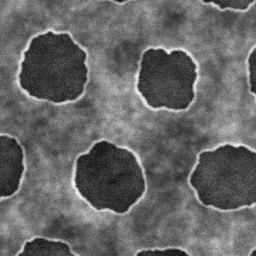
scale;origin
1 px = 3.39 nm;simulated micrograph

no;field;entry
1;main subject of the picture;holes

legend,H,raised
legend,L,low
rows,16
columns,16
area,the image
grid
HHHHHHHHHHHHHHLH
HHHHHHHHHHHHHHHH
HHLLLHHHHHHHHHHH
HLLLLHHHHLLLHHHH
HLLLLHHHHLLLHHHH
HLLLLHHHHLLLHHHH
HHHHHHHHHLLLHHHH
HHHHHHHHHHHHHHHH
LHHHHHHHHHHHHHHH
LHHHHLLLHHHHHLLL
LHHHHLLLLHHHLLLL
LHHHHLLLLHHHLLLL
HHHHHLLLLHHHHLLL
HHHHHHHHHHHHHHHH
HHHHHHHHHHHHHHHH
HLLLHHHHHHHHHHHH